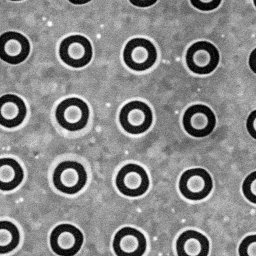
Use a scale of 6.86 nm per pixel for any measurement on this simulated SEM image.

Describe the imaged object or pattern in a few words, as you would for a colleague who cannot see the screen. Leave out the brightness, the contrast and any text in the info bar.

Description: an array of small figures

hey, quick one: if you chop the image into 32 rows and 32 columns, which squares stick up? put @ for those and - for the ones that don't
@@@@@@@@@--@@@@@---@@@@@----@@@@
@@@@@@@@@@@@@@@@@@@@@@@@@@@@@@@@
@@@@@@@@@@@@@@@@@@@@@@@@@@@@@@@@
@@@@@@@@@@@@@@@@@@@@@@@@@@@@@@@@
---@@@@@---@@@@@@@@@@@@@@@@@@@@@
----@@@----@@@@@---@@@@@---@@@@@
----@@@-----@@@-----@@@----@@@@-
---@@@@@---@@@@-----@@@----@@@@-
@@@@@@@@@-@@@@@@---@@@@----@@@@-
@@@@@@@@@@@@@@@@@@@@@@@@@@@@@@@@
@@@@@@@@@@@@@@@@@@@@@@@@@@@@@@@@
@@@@@@@@@@@@@@@@@@@@@@@@@@@@@@@@
---@@@@@---@@@@@@-@@@@@@@@@@@@@@
---@@@@----@@@@----@@@@---@@@@@@
---@@@@----@@@@----@@@@----@@@@-
---@@@@----@@@@----@@@@----@@@@-
@@@@@@@@--@@@@@@--@@@@@---@@@@@-
@@@@@@@@@@@@@@@@@@@@@@@@@@@@@@@@
@@@@@@@@@@@@@@@@@@@@@@@@@@@@@@@@
@@@@@@@@@@@@@@@@@@@@@@@@@@@@@@@@
---@@@@----@@@@@-@@@@@@@@@@@@@@@
---@@@-----@@@@---@@@@@---@@@@@@
---@@@-----@@@-----@@@-----@@@--
--@@@@@----@@@@----@@@-----@@@--
@@@@@@@@@@@@@@@---@@@@@---@@@@--
@@@@@@@@@@@@@@@@@@@@@@@@@@@@@@@@
@@@@@@@@@@@@@@@@@@@@@@@@@@@@@@@@
-@@@@@@@@@@@@@@@@@@@@@@@@@@@@@@@
--@@@@@---@@@@@--@@@@@@@@@@@@@@@
---@@@----@@@@----@@@@----@@@@@-
---@@@----@@@@----@@@@----@@@@--
--@@@@@---@@@@----@@@@----@@@@--